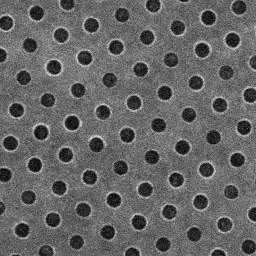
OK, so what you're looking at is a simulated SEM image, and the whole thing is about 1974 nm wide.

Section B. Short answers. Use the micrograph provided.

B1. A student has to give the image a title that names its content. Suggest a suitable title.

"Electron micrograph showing a regular array of holes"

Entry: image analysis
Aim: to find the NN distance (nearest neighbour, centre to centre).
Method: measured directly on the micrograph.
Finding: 249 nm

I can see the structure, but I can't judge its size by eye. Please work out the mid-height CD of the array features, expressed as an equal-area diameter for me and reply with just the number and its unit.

118 nanometers